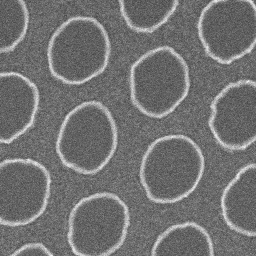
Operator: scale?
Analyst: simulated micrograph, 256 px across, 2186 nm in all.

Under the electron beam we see raised bodies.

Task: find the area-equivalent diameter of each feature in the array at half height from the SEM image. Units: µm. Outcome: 0.534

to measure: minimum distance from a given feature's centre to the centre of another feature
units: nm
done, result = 743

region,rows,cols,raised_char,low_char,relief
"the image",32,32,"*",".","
***............*******....******
***............******....*******
***......***....*****....*******
***.....*****....**......*******
***....******............*******
**....********............******
......********.....***....*****.
......*******....******....**...
......*******....******.........
***....*****....*******.........
****............*******......***
*****............******.....****
*****............******....*****
*****.....***.....****.....*****
****....******.....*.......*****
****....******............******
***.....******.............*****
*......*******......****...*****
.......*******.....******.......
........******....*******.......
*****...*****.....*******.......
******.....*......*******.....**
******............*******....***
******............******....****
******......**.....****.....****
******....*****.............****
*****....*******............****
****.....*******............****
.........*******.....****....***
.........******.....******......
.........******....*******......
..****...*****.....*******......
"